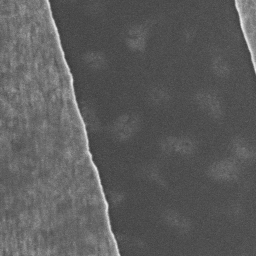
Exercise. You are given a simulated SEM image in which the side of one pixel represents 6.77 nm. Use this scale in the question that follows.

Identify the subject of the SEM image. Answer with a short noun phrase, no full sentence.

one or a few lines or trenches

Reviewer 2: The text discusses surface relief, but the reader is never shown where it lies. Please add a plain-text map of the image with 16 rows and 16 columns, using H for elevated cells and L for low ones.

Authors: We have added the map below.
HHHLLLLLLLLLLLLH
HHHLLLLLLLLLLLLH
HHHHLLLLLLLLLLLH
HHHHLLLLLLLLLLLL
HHHHLLLLLLLLLLLL
HHHHHLLLLLLLLLLL
HHHHHLLLLLLLLLLL
HHHHHLLLLLLLLLLL
HHHHHLLLLLLLLLLL
HHHHHHLLLLLLLLLL
HHHHHHLLLLLLLLLL
HHHHHHLLLLLLLLLL
HHHHHHHLLLLLLLLL
HHHHHHHLLLLLLLLL
HHHHHHHLLLLLLLLL
HHHHHHHLLLLLLLLL